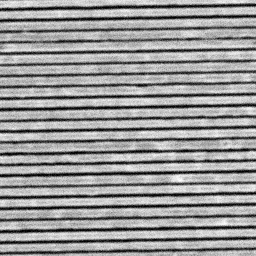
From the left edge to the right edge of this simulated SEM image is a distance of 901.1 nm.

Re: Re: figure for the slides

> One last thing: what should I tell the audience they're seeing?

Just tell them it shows parallel lines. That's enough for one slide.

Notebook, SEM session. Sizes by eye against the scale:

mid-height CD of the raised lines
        29.1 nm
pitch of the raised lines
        39.1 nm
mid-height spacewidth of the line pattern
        12.8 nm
